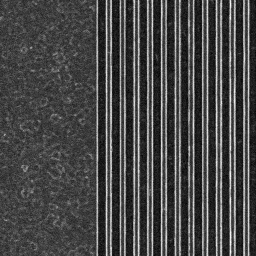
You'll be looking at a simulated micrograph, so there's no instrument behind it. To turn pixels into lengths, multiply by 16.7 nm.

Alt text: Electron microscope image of parallel lines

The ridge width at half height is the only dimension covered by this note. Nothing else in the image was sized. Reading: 4.75 pixels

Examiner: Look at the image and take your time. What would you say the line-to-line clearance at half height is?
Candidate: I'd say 144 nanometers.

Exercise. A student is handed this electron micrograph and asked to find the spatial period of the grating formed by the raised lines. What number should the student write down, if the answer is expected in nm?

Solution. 230